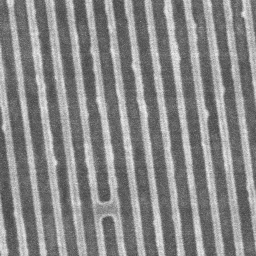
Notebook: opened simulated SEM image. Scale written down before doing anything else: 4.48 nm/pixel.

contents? parallel lines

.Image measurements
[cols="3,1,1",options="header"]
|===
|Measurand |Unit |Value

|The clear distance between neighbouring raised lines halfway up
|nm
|55.5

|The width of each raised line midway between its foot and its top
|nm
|30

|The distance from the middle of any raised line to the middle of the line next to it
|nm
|87.3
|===